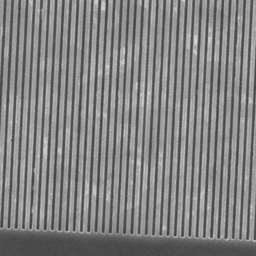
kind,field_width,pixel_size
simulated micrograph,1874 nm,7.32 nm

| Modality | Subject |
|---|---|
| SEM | parallel lines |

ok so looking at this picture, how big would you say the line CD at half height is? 28.3 nm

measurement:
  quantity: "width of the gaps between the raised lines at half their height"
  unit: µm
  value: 0.021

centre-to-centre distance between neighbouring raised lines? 53 nm